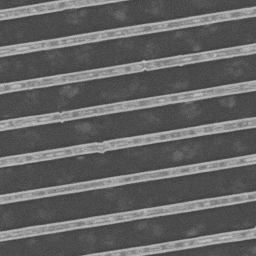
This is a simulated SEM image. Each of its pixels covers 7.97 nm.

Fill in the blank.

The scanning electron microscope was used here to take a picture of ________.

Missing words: parallel lines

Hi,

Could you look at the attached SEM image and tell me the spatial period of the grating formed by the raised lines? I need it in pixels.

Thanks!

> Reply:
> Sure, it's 36.4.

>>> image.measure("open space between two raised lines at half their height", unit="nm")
228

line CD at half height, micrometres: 0.063